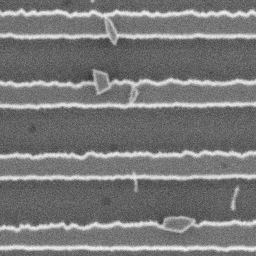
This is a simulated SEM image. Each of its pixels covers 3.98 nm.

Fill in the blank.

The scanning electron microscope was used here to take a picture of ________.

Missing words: lines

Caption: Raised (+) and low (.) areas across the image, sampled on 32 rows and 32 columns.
................................
..+....+......+........+.......+
++++++++++++++++++++++++++++++++
++++++++++++++++++++++++++++++++
++++++++++++++++++++++++++++++++
................................
................................
................................
................................
............+...................
++.++++++.++++++++++++++++++++++
++++++++++++++++++++++++++++++++
++++++++++++++++++++++++++++++++
................................
................................
................................
................................
................................
................................
.+++.++++.++++++++++++++++++++++
++++++++++++++++++++++++++++++++
++++++++++++++++++++++++++++++++
................................
................................
................................
................................
................................
.....................+++........
++++++++++++++++++++++++++++++++
++++++++++++++++++++++++++++++++
++++++++++++++++++++++++++++++++
................................